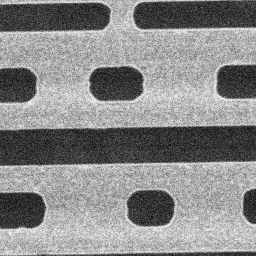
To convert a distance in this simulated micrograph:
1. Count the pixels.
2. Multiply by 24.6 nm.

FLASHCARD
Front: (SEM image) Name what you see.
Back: parallel lines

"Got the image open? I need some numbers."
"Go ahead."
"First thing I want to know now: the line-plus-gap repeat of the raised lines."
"1530 nm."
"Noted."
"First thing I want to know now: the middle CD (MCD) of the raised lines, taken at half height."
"25.5 px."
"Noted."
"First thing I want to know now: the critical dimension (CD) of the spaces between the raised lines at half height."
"906 nm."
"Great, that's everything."